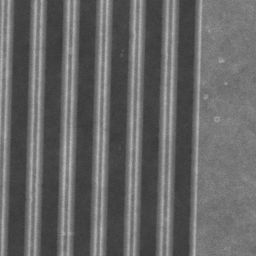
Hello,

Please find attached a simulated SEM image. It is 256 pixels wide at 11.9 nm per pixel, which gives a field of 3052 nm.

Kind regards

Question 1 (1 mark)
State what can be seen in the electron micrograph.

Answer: parallel lines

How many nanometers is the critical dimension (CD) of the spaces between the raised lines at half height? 258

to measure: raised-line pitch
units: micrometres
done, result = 0.393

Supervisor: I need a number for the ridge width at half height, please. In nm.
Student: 134